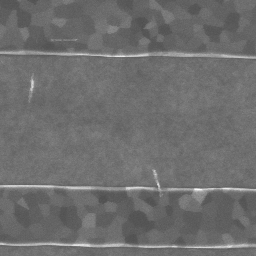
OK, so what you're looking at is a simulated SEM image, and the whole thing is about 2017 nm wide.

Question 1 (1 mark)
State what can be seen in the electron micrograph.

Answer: wiring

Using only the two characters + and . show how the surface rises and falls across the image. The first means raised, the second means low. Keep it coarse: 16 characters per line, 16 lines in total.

++++++++++++++++
++++++++++++++++
++++++++++++++++
......+++....+++
................
................
................
................
................
................
................
................
++++++++++++++++
++++++++++++++++
++++++++++++++++
................